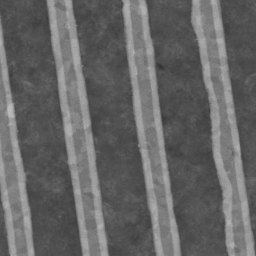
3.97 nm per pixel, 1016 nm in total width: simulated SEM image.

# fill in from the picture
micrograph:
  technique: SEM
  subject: one or a few lines or trenches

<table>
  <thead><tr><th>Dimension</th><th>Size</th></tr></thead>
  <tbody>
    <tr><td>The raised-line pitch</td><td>288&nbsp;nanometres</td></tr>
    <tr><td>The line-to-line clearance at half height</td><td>217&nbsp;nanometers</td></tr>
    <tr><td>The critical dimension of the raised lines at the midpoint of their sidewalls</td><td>69.8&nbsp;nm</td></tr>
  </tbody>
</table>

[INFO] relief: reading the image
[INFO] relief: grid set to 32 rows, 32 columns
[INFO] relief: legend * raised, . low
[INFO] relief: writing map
......***.......**......***.....
.......**.......**.......**.....
.......**.......**.......**.....
.......**.......**.......**.....
.......**.......**.......**.....
.......**.......***......***....
.......**.......***......***....
.......***......***.......**....
*.......**.......**.......**....
*.......**.......**.......**....
*.......**.......**.......**....
*.......**.......**.......**....
*.......**.......**........**...
*.......***......***.......**...
*.......***......***.......**...
**.......**.......**.......**...
**.......**.......**.......**...
**.......**.......**.......**...
**.......**.......**.......***..
**.......**.......**.......***..
**.......**.......**.......***..
***......***......***.......**..
***.......**.......**.......**..
***.......**.......**.......**..
.**.......**.......**.......**..
.**.......**.......**.......**..
.**.......**.......**.......***.
.**.......**.......***.......**.
.**.......***.......**.......**.
.**.......***.......**.......**.
..**.......**.......**.......**.
..**.......**.......**.......**.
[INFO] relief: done